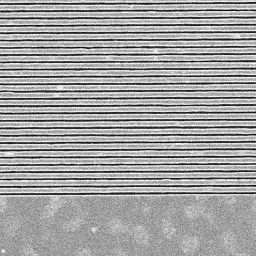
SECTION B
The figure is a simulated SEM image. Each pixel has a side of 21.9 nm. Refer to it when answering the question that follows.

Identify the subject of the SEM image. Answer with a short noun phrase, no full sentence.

parallel lines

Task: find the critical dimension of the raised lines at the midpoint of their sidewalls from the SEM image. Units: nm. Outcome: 112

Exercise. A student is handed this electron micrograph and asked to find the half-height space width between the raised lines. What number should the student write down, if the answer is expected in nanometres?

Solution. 57.5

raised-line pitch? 160 nanometers